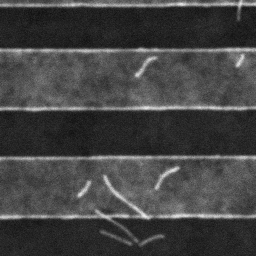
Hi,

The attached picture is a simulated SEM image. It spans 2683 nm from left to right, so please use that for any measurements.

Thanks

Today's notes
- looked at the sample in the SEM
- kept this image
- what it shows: lines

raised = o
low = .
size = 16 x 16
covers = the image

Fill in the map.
................
................
................
oooooooooooooooo
oooooooooooooooo
oooooooooooooooo
oooooooooooooooo
................
................
................
oooooooooooooooo
oooooooooooooooo
oooooooooooooooo
oooooooooooooooo
................
................